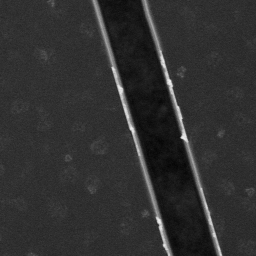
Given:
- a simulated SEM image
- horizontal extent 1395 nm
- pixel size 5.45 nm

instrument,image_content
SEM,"one or a few lines or trenches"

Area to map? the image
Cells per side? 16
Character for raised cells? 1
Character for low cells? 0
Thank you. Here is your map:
1111110001111111
1111110001111111
1111111000111111
1111111000111111
1111111000111111
1111111100011111
1111111100011111
1111111100011111
1111111100011111
1111111110001111
1111111110001111
1111111110001111
1111111111000111
1111111111000111
1111111111000111
1111111111100011